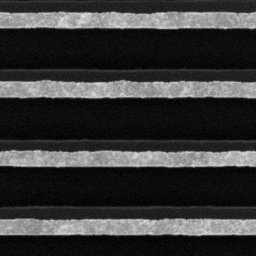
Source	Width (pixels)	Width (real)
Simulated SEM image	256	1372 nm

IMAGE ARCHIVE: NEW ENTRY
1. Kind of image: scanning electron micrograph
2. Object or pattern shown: lines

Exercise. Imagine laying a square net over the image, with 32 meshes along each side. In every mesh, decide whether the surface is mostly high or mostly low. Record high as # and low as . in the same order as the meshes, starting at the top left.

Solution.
################################
################################
################################
........##.....#...####....##..#
................................
................................
................................
................................
................................
################################
################################
################################
................................
................................
................................
................................
................................
................................
################################
################################
################################
................................
................................
................................
................................
................................
################################
################################
################################
................................
................................
................................